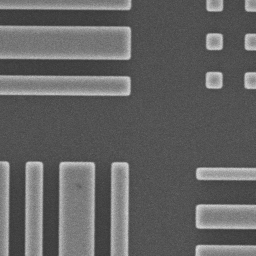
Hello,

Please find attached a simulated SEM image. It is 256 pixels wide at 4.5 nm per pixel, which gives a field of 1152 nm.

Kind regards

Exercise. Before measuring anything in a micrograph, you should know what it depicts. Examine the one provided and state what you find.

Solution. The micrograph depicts groups of lines, slits or small figures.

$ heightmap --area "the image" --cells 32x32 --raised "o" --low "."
oooooooooooooooo..........oo...o
................................
................................
oooooooooooooooo................
oooooooooooooooo..........oo...o
oooooooooooooooo..........oo...o
oooooooooooooooo................
................................
................................
ooooooo...................oo...o
oooooooooooooooo..........oo...o
oooooooooooooooo................
................................
................................
................................
................................
................................
................................
................................
................................
o..oo...oooo..oo................
o..oo..ooooo..oo.........ooooooo
o..oo..ooooo..oo................
o..oo..ooooo..oo................
o..oo..ooooo..oo................
o..oo..ooooo..oo................
o..oo..ooooo..oo.........ooooooo
o..oo..ooooo..oo.........ooooooo
o..oo..ooooo..oo.........ooooooo
o..oo..ooooo..oo................
o..oo..ooooo..oo................
o..oo..ooooo..oo........oooooooo